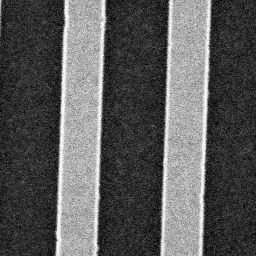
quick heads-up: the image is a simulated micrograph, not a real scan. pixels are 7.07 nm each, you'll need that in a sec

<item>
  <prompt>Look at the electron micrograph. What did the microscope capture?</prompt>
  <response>one or a few lines or trenches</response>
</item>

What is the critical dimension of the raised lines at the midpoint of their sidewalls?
271 nanometers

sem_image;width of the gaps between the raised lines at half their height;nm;470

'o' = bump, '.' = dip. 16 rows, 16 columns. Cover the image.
....ooo....oo...
....ooo....oo...
....oo.....oo...
....oo.....oo...
....oo.....oo...
....oo.....oo...
....oo....ooo...
....oo....ooo...
....oo....ooo...
....oo....ooo...
....oo....ooo...
....oo....ooo...
....oo....ooo...
....oo....ooo...
....oo....ooo...
....oo....ooo...